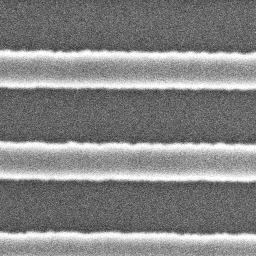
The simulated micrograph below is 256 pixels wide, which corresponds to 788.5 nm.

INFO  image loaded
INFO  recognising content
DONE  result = lines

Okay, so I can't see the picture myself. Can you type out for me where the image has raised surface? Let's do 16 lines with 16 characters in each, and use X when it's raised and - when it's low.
----------------
----------------
----------------
XXXXXXXXXXXXXXXX
XXXXXXXXXXXXXXXX
--------------XX
----------------
----------------
----------------
XXXXXXXXXXXXXXXX
XXXXXXXXXXXXXXXX
----------------
----------------
----------------
----------------
XXXXXXXXXXXXXXXX